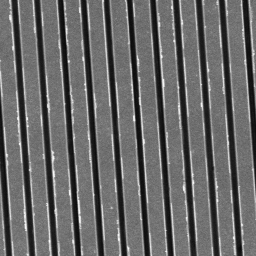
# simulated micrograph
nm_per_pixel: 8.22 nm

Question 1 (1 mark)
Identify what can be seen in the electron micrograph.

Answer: parallel lines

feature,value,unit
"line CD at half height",144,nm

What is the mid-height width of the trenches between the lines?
50.2 nm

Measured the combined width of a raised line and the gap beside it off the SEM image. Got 189 nanometres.